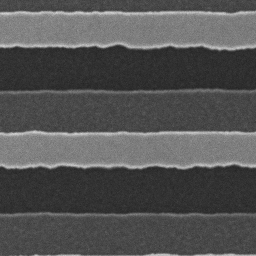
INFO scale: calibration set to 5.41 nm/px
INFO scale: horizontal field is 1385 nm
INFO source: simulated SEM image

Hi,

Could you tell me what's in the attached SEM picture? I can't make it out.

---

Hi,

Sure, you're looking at lines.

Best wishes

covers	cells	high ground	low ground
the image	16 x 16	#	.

################
################
################
................
................
................
################
################
################
################
................
................
................
################
################
################